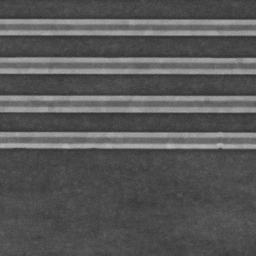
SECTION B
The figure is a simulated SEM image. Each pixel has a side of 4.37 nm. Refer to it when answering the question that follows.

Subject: parallel lines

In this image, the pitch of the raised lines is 165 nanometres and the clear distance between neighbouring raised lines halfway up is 115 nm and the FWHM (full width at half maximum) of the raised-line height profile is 53.5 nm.